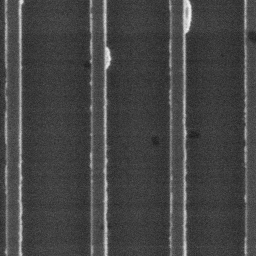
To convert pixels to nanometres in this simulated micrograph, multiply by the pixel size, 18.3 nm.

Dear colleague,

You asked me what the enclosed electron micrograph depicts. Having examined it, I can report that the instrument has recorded lines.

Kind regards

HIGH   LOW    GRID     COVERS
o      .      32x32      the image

.oo........oo........oo........o
.oo........oo........oo........o
.oo........oo........oo........o
.oo........oo........oo........o
.oo........oo........oo........o
.oo........oo........oo........o
.oo........oo........oo........o
.oo........oo........oo........o
.oo........oo........oo........o
.oo........oo........oo........o
.oo........oo........oo........o
.oo........oo........oo........o
.oo........oo........oo........o
.oo........oo........oo........o
.oo........oo........oo........o
.oo........oo........oo........o
.oo........oo........oo........o
.oo........oo........oo........o
.oo........oo........oo........o
.oo........oo........oo........o
.oo........oo........oo........o
.oo........oo........oo........o
.oo........oo........oo........o
.oo........oo........oo........o
.oo........oo........oo........o
.oo........oo........oo........o
.oo........oo........oo........o
.oo........oo........oo........o
.oo........oo........oo........o
.oo........oo........oo........o
.oo........oo........oo........o
.oo........oo........oo........o